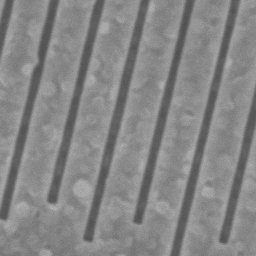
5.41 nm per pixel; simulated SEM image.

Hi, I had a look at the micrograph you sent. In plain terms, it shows parallel lines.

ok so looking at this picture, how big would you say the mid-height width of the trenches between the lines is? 52 nm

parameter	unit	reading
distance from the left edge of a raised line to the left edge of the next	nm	238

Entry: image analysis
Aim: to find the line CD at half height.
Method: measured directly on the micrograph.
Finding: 182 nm